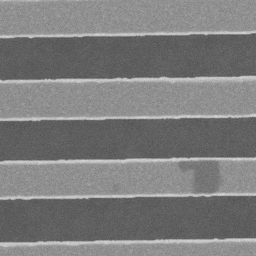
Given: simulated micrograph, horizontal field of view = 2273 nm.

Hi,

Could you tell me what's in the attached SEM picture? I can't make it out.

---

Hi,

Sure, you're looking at lines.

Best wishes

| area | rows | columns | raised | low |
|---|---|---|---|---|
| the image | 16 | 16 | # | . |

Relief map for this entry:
################
################
................
................
................
################
################
##..............
................
................
################
################
................
................
................
################